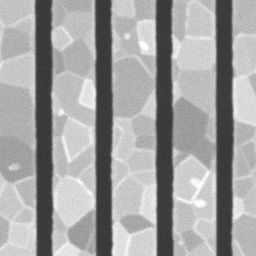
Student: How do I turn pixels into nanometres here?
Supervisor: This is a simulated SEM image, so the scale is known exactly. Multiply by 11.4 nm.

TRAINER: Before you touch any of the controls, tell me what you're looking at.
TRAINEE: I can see lines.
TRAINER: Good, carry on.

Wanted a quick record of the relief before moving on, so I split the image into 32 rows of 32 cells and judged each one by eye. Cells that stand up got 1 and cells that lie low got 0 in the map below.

11110001111100111110001111100111
11110001111100111110001111100111
11110001111100111110001111100111
11110001111100111110001111100111
11110001111100111110001111100111
11110001111100111110001111100111
11110001111100111110001111100111
11110001111100111110001111100111
11110001111100111110001111100111
11110001111100111110001111100111
11110001111100111110001111100111
11110001111100111110001111100111
11110001111100111110001111100111
11110001111100111110001111100111
11110001111100111110001111100111
11110001111100111110001111100111
11110001111100111110001111100111
11110001111100111110001111100111
11110001111100111110001111100111
11110001111100111110001111100111
11110001111100111110001111100111
11110001111100111110001111100111
11110001111100111110001111100111
11110001111100111110001111100111
11110001111100111110001111100111
11110001111100111110001111100111
11110001111100111110001111100111
11110001111100111110001111100111
11110001111100111110001111100111
11110001111100111110001111100111
11110001111100111110001111100111
11110001111100111110001111100111